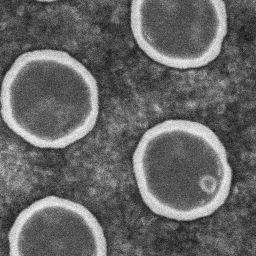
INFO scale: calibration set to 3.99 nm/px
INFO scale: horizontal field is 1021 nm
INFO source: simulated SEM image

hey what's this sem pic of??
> raised bodies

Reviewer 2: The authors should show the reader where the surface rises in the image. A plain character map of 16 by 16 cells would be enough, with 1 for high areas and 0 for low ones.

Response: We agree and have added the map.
0000000011111100
0000000001111100
0000000001111100
0011000000111000
0111100000000000
1111110000000000
1111110000000000
0111110000000000
0111100001111000
0000000001111100
0000000001111100
0000000001111100
0000000001111100
0111110000010000
0111110000000000
0111110000000000